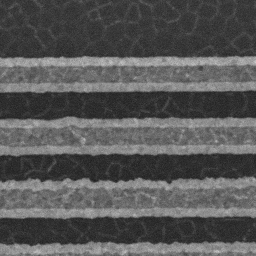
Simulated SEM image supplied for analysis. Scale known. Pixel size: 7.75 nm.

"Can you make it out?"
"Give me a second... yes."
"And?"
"one or a few lines or trenches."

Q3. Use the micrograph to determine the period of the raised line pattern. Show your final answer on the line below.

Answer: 0.48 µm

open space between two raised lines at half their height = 280 nanometres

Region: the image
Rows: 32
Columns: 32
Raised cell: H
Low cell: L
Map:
LLLLLLLLLLLLLLLLLLLLLLLLLLLLLLLL
LLLLLLLLLLLLLLLLLLLLLLLLLLLLLLLL
LLLLLLLLLLLLLLLLLLLLLLLLLLLLLLLL
LLLLLLLLLLLLLLLLLLLLLLLLLLLLLLLL
LLLLLLLLLLLLLLLLLLLLLLLLLLLLLLLL
LLLLLLLLLLLLLLLLLLLLLLLLLLLLLLLL
LLLLLLLLLLLLLLLLLLLLLLLLLLLLLLLL
LLLLLLLLLLLLLLLLLLLLLLLLLLLLLLLL
HHHHHHHHHHHHHHHHHHHHHHHHHHHHHHHH
HHHHHHHHHHHHHHHHHHHHHHHHHHHHHHHH
HHHHHHHHHHHHHHHHHHHHHHHHHHHHHHHH
LLLLLLLLLLLLLLLLLLLLLLLLLLLLLLLL
LLLLLLLLLLLLLLLLLLLLLLLLLLLLLLLL
LLLLLLLLLLLLLLLLLLLLLLLLLLLLLLLL
LLLLLLLLLLLLLLLLLLLLLLLLLLLLLLLL
HHHLLLLLHHLLHHHHHHHHHHHHHHLHHHHH
HHHHHHHHHHHHHHHHHHHHHHHHHHHHHHHH
HHHHHHHHHHHHHHHHHHHHHHHHHHHHHHHH
HHHHHHHHHHHHHHHHHHHHHHHHHHHHHHHH
LLLLLLLLLLLLLLLLLLLLLLLLLLLLLLLL
LLLLLLLLLLLLLLLLLLLLLLLLLLLLLLLL
LLLLLLLLLLLLLLLLLLLLLLLLLLLLLLLL
LLLLLLLLLLLLLLLLLLLLLLLLLLLLLLLL
HHHHHHHHHHHHHHHHHHHHHHHHHHHHHHHH
HHHHHHHHHHHHHHHHHHHHHHHHHHHHHHHH
HHHHHHHHHHHHHHHHHHHHHHHHHHHHHHHH
HHHHHHHHHHHHHHHHHHLLHLLLLHLHLLLH
LLLLLLLLLLLLLLLLLLLLLLLLLLLLLLLL
LLLLLLLLLLLLLLLLLLLLLLLLLLLLLLLL
LLLLLLLLLLLLLLLLLLLLLLLLLLLLLLLL
LLLLLLLLLLLLLLLLLLLLLLLLLLLLLLLL
HHHHHHHHHHHHHHHHHHHHHHHHHHHHHHHH